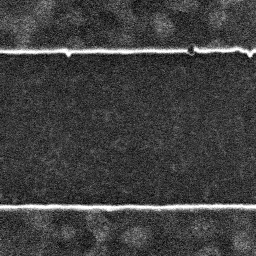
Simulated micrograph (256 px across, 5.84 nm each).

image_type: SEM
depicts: one or a few lines or trenches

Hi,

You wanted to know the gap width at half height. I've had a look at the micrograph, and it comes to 904 nanometres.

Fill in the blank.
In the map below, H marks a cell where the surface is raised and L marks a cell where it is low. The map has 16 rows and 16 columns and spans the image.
HHHHHHHHHHHHHHHH
HHHHHHHHHHHHHHHH
HHHHHHHHHHHHHHHH
LLLLLLLLLLLLLLLL
LLLLLLLLLLLLLLLL
LLLLLLLLLLLLLLLL
LLLLLLLLLLLLLLLL
LLLLLLLLLLLLLLLL
LLLLLLLLLLLLLLLL
LLLLLLLLLLLLLLLL
LLLLLLLLLLLLLLLL
LLLLLLLLLLLLLLLL
LLLLLLLLLLLLLLLL
HHHHHHHHHHHHHHHH
HHHHHHHHHHHHHHHH
HHHHHHHHHHHHHHHH